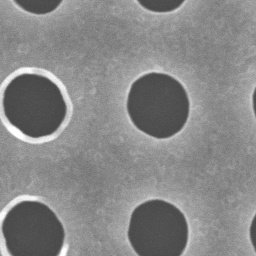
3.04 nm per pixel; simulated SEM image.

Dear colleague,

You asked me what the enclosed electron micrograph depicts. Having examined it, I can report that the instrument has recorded holes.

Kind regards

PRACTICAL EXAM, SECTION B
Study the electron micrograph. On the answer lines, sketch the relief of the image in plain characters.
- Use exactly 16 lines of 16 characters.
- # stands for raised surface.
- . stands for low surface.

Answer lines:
#...#####..#####
################
################
################
################
....####...#####
....####....####
#...####....####
##.######..#####
################
################
################
#########.######
....####...#####
....####....####
....####....####